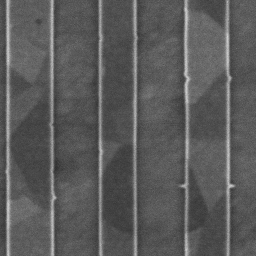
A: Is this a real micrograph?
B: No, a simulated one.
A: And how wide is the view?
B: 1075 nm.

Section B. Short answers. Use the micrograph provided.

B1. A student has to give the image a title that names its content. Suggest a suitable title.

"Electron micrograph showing one or a few lines or trenches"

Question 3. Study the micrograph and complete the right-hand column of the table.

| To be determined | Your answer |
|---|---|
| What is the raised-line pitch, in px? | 88.6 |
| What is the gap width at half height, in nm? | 205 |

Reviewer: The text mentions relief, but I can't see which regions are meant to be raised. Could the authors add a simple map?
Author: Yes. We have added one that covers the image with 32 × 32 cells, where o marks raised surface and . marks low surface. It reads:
.ooooo.......oooo......ooooo....
.ooooo.......oooo......ooooo....
.ooooo.......oooo......ooooo....
.ooooo.......oooo......ooooo....
.ooooo.......oooo......ooooo....
.ooooo.......oooo......ooooo....
.ooooo.......oooo......ooooo....
.ooooo.......oooo......ooooo....
.ooooo.......oooo......ooooo....
.ooooo.......oooo......oooooo...
.ooooo.......oooo......oooooo...
.ooooo.......oooo......ooooo....
.ooooo.......oooo......ooooo....
.ooooo......ooooo......ooooo....
.ooooo......ooooo......ooooo....
.ooooo......ooooo......ooooo....
.oooooo.....ooooo......ooooo....
.oooooo.....ooooo......ooooo....
.oooooo.....ooooo......ooooo....
.oooooo......oooo......ooooo....
.oooooo......oooo......ooooo....
.oooooo......oooo......ooooo....
.oooooo......oooo......ooooo....
.oooooo......oooo......oooooo...
.oooooo......oooo......oooooo...
.oooooo......oooo......oooooo...
.oooooo......oooo......oooooo...
.oooooo......oooo......oooooo...
.oooooo......oooo......oooooo...
.oooooo......oooo......oooooo...
.oooooo......oooo......oooooo...
.oooooo......oooo......oooooo...